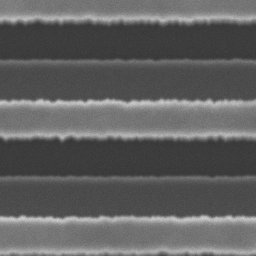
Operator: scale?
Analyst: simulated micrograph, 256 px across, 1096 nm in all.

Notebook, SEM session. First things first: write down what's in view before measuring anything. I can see lines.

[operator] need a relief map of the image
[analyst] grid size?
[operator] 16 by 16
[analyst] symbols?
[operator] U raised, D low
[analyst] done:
UUUUUUUUUUUUUUUU
DDDDDDDDDDDDDDDD
DDDDDDDDDDDDDDDD
DDDDDDDDDDDDDDDD
UUUUUUUUUUUUUUUU
UUUUUUUUUUUUUUUU
UUUUUUUUUUUUUUUU
UUUUUUUUUUUUUUUU
UUUUUUUUUUUUUUUU
DDDDDDDDDDDDDDDD
DDDDDDDDDDDDDDDD
UUUUUUUUUUUUUUUU
UUUUUUUUUUUUUUUU
UUUUUUUUUUUUUUUU
UUUUUUUUUUUUUUUU
UUUUUUUUUUUUUUUU